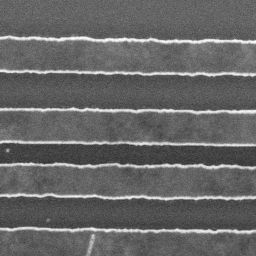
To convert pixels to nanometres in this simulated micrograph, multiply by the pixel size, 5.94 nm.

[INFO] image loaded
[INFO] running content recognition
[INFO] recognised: lines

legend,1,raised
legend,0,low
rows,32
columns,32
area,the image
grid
00000000000000000000000000000000
00000000000000000000000000000000
00000000000000000000000000000000
00000000000000000000000000000000
00000000000000000000000000000000
11111111111111111111111111111111
11111111111111111111111111111111
11111111111111111111111111111111
11111111111111111111111111111111
00000000000000000000000000000000
00000000000000000000000000000000
00000000000000000000000000000000
00000000000000000000000000000000
00000000000000000000000000000000
11111111111111111111111111111111
11111111111111111111111111111111
11111111111111111111111111111111
11111111111111111111111111111111
00000000000000000000000000000000
00000000000000000000000000000000
01111011100000100000000000000000
11111111111111111111111111111111
11111111111111111111111111111111
11111111111111111111111111111111
01001101111111111111111111111111
00000000000000000000000000000000
00000000000000000000000000000000
00000000000000000000000000000000
00111000000000000000000000000000
11111111111111111111111111111111
11111111111111111111111111111111
11111111111111111111111111111111